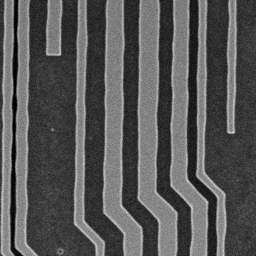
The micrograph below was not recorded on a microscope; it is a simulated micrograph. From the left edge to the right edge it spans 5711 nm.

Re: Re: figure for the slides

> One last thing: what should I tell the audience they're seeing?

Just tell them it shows groups of lines, slits or small figures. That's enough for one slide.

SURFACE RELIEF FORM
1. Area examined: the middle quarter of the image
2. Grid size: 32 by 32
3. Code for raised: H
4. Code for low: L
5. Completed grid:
LLLHHLLLLLLHHHHLLLLHHHHHLLLHHHHL
LLLHHLLLLLLHHHHLLLLHHHHHLLLHHHHL
LLLHHLLLLLHHHHHLLLLHHHHHLLLHHHHL
LLLHHLLLLLHHHHHLLLLHHHHHLLLHHHHL
LLLHHLLLLLHHHHHLLLLHHHHHLLLHHHHL
LLLHHLLLLLLHHHLLLLLHHHHHLLLHHHHL
LLLHHLLLLLLHHHHLLLLHHHHHLLLHHHHL
LLLHHLLLLLLHHHHLLLLHHHHHLLLHHHHL
LLLHHLLLLLHHHHHLLLLHHHHLLLLHHHHL
LLLHHLLLLLHHHHHLLLLHHHHLLLLHHHHL
LLLHHLLLLLHHHHHLLLLHHHHLLLLHHHHL
LLLHHLLLLLLHHHHLLLLHHHHLLLLHHHHL
LLLHHLLLLLLHHHHLLLLHHHHLLLLHHHHL
LLLHHLLLLLLHHHHLLLLHHHHLLLLHHHHL
LLLHHLLLLLLHHHLLLLLHHHHLLLLHHHHL
LLLHHLLLLLHHHHLLLLLHHHHLLLLHHHHL
LLLHHLLLLLHHHHLLLLLHHHHLLLLHHHHL
LLLHHLLLLLHHHHLLLLLHHHHLLLLHHHHL
LLLHHLLLLLHHHHLLLLLHHHHLLLLHHHHL
LLLHHLLLLLLHHHLLLLLHHHHLLLLHHHHL
LLLHHLLLLLHHHHLLLLLHHHHLLLLHHHHL
LLLHHLLLLLHHHHLLLLLHHHHLLLLHHHHL
LLLHHLLLLLHHHHLLLLLHHHHLLLLHHHHL
LLLHHLLLLLHHHHLLLLLHHHHLLLLHHHHL
LLLHHLLLLLHHHHLLLLLHHHHLLLLHHHHL
LLLHHLLLLLHHHHLLLLLHHHHLLLLHHHHL
LLLHHLLLLLHHHHLLLLLHHHHLLLLHHHHL
LLLHHLLLLLHHHHLLLLLHHHHLLLLHHHHL
LLLHHLLLLLHHHHLLLLLHHHHLLLLHHHHL
LLLHHLLLLLHHHHLLLLLHHHHLLLLHHHHL
LLLHHLLLLLHHHHLLLLLHHHHLLLLHHHHH
LLLHHLLLLLHHHHLLLLLHHHHLLLLLHHHH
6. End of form